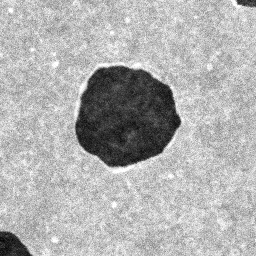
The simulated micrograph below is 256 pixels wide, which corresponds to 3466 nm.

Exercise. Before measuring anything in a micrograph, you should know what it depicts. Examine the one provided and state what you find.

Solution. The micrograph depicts holes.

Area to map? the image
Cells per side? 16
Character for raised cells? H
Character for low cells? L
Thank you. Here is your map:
HHHHHHHHHHHHHHHH
HHHHHHHHHHHHHHHH
HHHHHHHHHHHHHHHH
HHHHHHHHHHHHHHHH
HHHHHHLLLHHHHHHH
HHHHHLLLLLLHHHHH
HHHHHLLLLLLHHHHH
HHHHHLLLLLLHHHHH
HHHHHLLLLLLHHHHH
HHHHHLLLLLHHHHHH
HHHHHHHLHHHHHHHH
HHHHHHHHHHHHHHHH
HHHHHHHHHHHHHHHH
HHHHHHHHHHHHHHHH
LHHHHHHHHHHHHHHH
LLHHHHHHHHHHHHHH